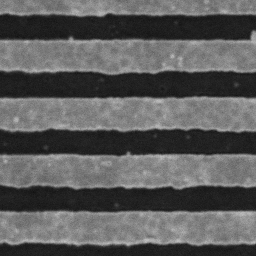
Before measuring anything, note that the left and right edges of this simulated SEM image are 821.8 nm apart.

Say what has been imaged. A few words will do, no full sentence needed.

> lines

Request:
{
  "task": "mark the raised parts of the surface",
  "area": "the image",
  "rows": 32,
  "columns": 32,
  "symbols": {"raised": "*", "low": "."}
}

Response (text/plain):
********************************
********************************
................................
................................
................................
********************************
********************************
********************************
********************************
................................
................................
................................
********************************
********************************
********************************
********************************
................................
................................
................................
......****........*******.******
********************************
********************************
********************************
.........*......................
................................
................................
................................
********************************
********************************
********************************
.........*..**..*.......*.......
................................